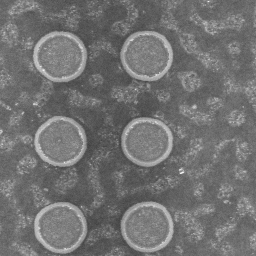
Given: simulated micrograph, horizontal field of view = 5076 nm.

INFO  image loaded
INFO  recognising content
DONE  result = raised bodies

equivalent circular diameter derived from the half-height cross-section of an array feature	0.954	microns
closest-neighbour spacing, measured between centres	1700	nm